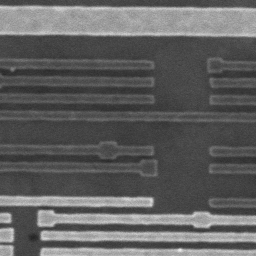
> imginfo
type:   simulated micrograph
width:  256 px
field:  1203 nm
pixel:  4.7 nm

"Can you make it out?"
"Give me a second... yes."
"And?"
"wiring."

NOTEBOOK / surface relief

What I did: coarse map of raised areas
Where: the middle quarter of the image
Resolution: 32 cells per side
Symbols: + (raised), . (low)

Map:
++++++++++++++++++++++..........
................................
................................
++++++++++++++++++++++..........
++++++++++++++++++++++..........
........+++.++++++++++..........
................................
................................
++++++++++++++++++++++..........
++++++++++++++++++++++..........
................................
................................
++++++++++++++++++++++++++++++++
++++++++++++++++++++++++++++++++
................................
................................
................................
................................
................................
................................
+++..+++++++++..................
++++++++++++++++++++++..........
++++++++++++++++++++++..........
.........++++...................
...................++++.........
+++++++++++++++++++++++.........
+++++++++++++++++++++++.........
...................++++.........
................................
................................
................................
................................